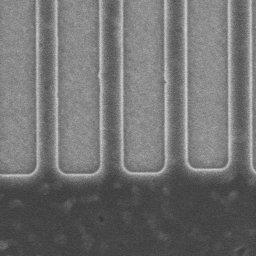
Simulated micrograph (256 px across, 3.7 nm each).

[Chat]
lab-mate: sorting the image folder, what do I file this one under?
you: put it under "one or a few lines or trenches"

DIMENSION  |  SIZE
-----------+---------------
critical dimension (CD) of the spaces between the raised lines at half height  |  0.157 microns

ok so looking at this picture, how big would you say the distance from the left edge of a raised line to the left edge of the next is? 64.2 px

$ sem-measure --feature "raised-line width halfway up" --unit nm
83.6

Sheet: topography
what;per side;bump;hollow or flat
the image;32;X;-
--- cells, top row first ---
-----XX------XX------XX------XX-
-----XX------XX------XX------XX-
-----XX------XX------XX------XX-
-----XX------XX------XX------XX-
-----XX------XX------XX------XX-
-----XX------XX------XX------XX-
-----XX------XX------XX------XX-
-----XX------XX------XX------XX-
-----XX------XX------XX------XX-
-----XX-----XXX------XX------XX-
-----XX------XX------XX------XX-
-----XX------XX------XX------XX-
-----XX------XX------XX------XX-
-----XX------XX------XX------XX-
-----XX------XX------XX------XX-
-----XX------XX------XX------XX-
-----XX------XX------XX------XX-
-----XX------XX------XX------XX-
-----XX------XX------XX------XX-
-----XX------XX------XX------XX-
-----XX------XX------XXX----XXX-
----XXXX----XXXX----XXXXXXXXXXXX
XXXXXXXXXXXXXXXXXXXXXXXXXXXXXXXX
XXXXXXXXXXXXXXXXXXXXXXXXXXXXXXXX
XXXXXXXXXXXXXXXXXXXXXXXXXXXXXXXX
XXXXXXXXXXXXXXXXXXXXXXXXXXXXXXXX
XXXXXXXXXXXXXXXXXXXXXXXXXXXXXXXX
XXXXXXXXXXXXXXXXXXXXXXXXXXXXXXXX
XXXXXXXXXXXXXXXXXXXXXXXXXXXXXXXX
XXXXXXXXXXXXXXXXXXXXXXXXXXXXXXXX
XXXXXXXXXXXXXXXXXXXXXXXXXXXXXXXX
XXXXXXXXXXXXXXXXXXXXXXXXXXXXXXXX